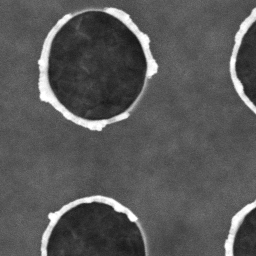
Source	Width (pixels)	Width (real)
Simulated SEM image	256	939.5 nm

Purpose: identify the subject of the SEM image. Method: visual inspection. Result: holes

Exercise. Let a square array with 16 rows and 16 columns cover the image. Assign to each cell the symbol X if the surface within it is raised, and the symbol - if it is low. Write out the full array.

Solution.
XXXXXXXXXXXXXXXX
XXXX----XXXXXXXX
XXX------XXXXXX-
XXX------XXXXXX-
XXX------XXXXXX-
XXX------XXXXXX-
XXXX----XXXXXXXX
XXXXXXXXXXXXXXXX
XXXXXXXXXXXXXXXX
XXXXXXXXXXXXXXXX
XXXXXXXXXXXXXXXX
XXXXXXXXXXXXXXXX
XXXXXXXXXXXXXXXX
XXXX----XXXXXXX-
XXX------XXXXXX-
XXX------XXXXXX-